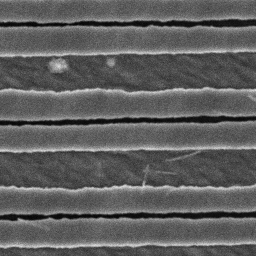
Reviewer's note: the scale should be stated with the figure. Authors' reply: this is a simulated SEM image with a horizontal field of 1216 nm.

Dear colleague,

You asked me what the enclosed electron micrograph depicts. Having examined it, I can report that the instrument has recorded lines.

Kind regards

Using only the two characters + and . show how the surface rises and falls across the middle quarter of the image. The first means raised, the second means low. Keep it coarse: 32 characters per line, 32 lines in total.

................................
................................
................................
................................
................................
................................
.....+++++.+...............+++++
++++++++++++++++++++++++++++++++
++++++++++++++++++++++++++++++++
++++++++++++++++++++++++++++++++
++++++++++++++++++++++++++++++++
++++++++++++++++++++++++++++++++
++++++++++++++++++++++++++++++++
+++++++++++++...................
................................
++++++++++++++++++++++++++++++++
++++++++++++++++++++++++++++++++
++++++++++++++++++++++++++++++++
++++++++++++++++++++++++++++++++
++++++++++++++++++++++++++++++++
++++++++++++++++++++++++++++++++
+++++++++++++.++................
................................
................................
................................
................................
................................
................................
................................
................................
..............+++...++...+...+..
+..+++++++++++++++++++++++++++++